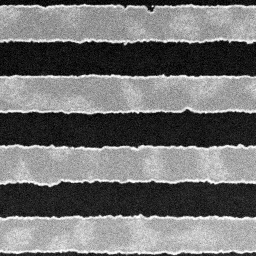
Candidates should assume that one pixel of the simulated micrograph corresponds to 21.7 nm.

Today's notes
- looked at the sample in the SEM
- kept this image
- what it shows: one or a few lines or trenches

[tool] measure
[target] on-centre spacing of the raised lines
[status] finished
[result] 1530 nanometres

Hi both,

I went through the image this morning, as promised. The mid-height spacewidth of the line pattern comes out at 0.757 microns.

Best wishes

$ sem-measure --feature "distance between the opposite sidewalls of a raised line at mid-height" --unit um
0.757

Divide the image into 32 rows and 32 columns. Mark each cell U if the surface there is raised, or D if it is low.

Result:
DDDDDDDDDDDDDDDDDDDDDDDDDDDDDDDD
UUUUUUUUUUUUUUUUUUUUUUUUUUUUUUUU
UUUUUUUUUUUUUUUUUUUUUUUUUUUUUUUU
UUUUUUUUUUUUUUUUUUUUUUUUUUUUUUUU
UUUUUUUUUUUUUUUUUUUUUUUUUUUUUUUU
DDDDDDDDDDDDDDDDDDDDDDDDDDDDDDDD
DDDDDDDDDDDDDDDDDDDDDDDDDDDDDDDD
DDDDDDDDDDDDDDDDDDDDDDDDDDDDDDDD
DDDDDDDDDDDDDDDDDDDDDDDDDDDDDDDD
DDDDDDDDDDDUUDDDDDDDDDDDDDDDDDDD
UUUUUUUUUUUUUUUUUUUUUUUUUUUUUUUU
UUUUUUUUUUUUUUUUUUUUUUUUUUUUUUUU
UUUUUUUUUUUUUUUUUUUUUUUUUUUUUUUU
UUUUUUUUUUUUUUUUUUUUUUUUUUUUUUUU
DDDDDDDDDDDDDDDDDDDDDDDDDDDDDDDD
DDDDDDDDDDDDDDDDDDDDDDDDDDDDDDDD
DDDDDDDDDDDDDDDDDDDDDDDDDDDDDDDD
DDDDDDDDDDDDDDDDDDDDDDDDDDDDDDDD
UUUUUUUUUDDDDUDUUUUUUUUUUDUUUUUU
UUUUUUUUUUUUUUUUUUUUUUUUUUUUUUUU
UUUUUUUUUUUUUUUUUUUUUUUUUUUUUUUU
UUUUUUUUUUUUUUUUUUUUUUUUUUUUUUUU
UUUUUUUUUUUUUUUUUUUUUUUUUUUUUUUU
DDDDDDDDDDDDDDDDDDDDDDDDDDDDDDDD
DDDDDDDDDDDDDDDDDDDDDDDDDDDDDDDD
DDDDDDDDDDDDDDDDDDDDDDDDDDDDDDDD
DDDDDDDDDDDDDDDDDDDDDDDDDDDDDDDD
UUUUUUUUUUUUUUUUUUUUUUUUUUUUUUUU
UUUUUUUUUUUUUUUUUUUUUUUUUUUUUUUU
UUUUUUUUUUUUUUUUUUUUUUUUUUUUUUUU
UUUUUUUUUUUUUUUUUUUUUUUUUUUUUUUU
DUUDDDDDDDUDUUUUUUUUUUUDUUUDDDUD